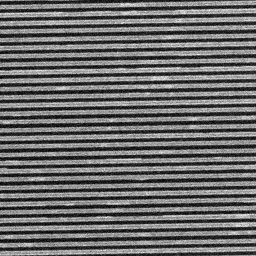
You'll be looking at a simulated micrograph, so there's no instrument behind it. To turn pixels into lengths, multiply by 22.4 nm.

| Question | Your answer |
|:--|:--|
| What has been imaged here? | parallel lines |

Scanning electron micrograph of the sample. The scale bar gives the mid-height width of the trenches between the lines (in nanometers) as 112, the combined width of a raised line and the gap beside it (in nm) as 184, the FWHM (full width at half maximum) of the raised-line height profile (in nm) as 75.5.